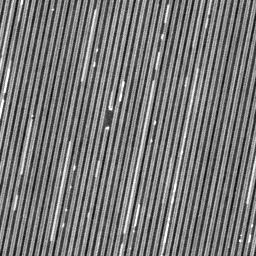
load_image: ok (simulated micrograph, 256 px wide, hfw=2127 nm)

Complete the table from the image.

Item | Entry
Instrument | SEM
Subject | parallel lines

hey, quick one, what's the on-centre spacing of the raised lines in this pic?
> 0.0531 µm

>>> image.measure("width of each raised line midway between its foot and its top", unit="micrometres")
0.0245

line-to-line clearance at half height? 31.6 nanometres